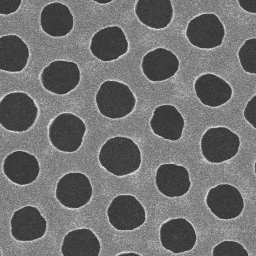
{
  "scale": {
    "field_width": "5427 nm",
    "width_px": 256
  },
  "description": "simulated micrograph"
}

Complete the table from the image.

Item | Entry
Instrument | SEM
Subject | a regular array of holes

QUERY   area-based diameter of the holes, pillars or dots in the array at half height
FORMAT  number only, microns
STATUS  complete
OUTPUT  0.762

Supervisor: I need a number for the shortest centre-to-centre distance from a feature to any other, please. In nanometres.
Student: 1190